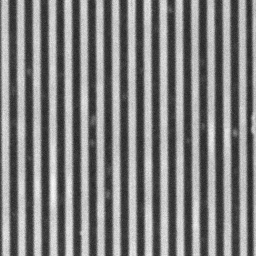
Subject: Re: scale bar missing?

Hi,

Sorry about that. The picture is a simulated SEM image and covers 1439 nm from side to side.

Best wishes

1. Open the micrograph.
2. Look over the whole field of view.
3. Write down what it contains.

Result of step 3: parallel lines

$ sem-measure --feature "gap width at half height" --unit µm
0.0527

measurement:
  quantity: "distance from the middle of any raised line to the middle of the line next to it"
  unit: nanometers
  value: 89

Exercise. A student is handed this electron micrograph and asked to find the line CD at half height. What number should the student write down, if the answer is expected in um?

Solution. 0.0365